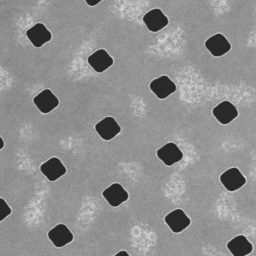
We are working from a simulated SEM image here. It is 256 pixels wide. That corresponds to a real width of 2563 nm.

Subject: a regular array of holes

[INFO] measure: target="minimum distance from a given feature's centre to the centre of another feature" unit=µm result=0.671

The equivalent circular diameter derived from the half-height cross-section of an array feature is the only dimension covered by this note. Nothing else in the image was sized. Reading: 227 nm